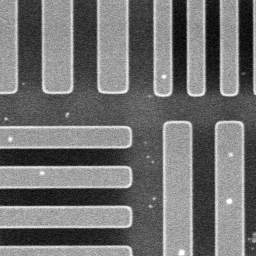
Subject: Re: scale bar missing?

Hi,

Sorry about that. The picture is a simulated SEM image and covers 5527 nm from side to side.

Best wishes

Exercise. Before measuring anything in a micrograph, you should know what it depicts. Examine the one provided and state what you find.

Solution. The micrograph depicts groups of lines, slits or small figures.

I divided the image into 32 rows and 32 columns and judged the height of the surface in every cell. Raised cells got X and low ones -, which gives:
XX---XXXX---XXXX---XX--XXX--XX--
XX---XXXX---XXXX---XX--XXX--XX--
XX---XXXX---XXXX---XX--XXX--XX--
XX---XXXX---XXXX---XX--XXX--XX--
XX---XXXX---XXXX---XX--XXX--XX--
XX---XXXX---XXXX---XX--XXX--XX--
XX---XXXX---XXXX---XX--XXX--XX--
XX---XXXX---XXXX---XX--XXX--XX--
XX---XXXX---XXXX---XX--XXX--XX--
XX---XXXX---XXXX---XX--XXX--XX--
XX---XXXX---XXXX---XX--XXX--XX--
XX----XXX----XXX---XX---X---XX--
--------------------------------
--------------------------------
--------------------------------
---------------------XXX---XXX--
XXXXXXXXXXXXXXXX----XXXX---XXX--
XXXXXXXXXXXXXXXX----XXXX---XXX--
--------------------XXXX---XXX--
--------------------XXXX---XXX--
--------------------XXXX---XXX--
XXXXXXXXXXXXXXXX----XXXX---XXX--
XXXXXXXXXXXXXXXX----XXXX---XXX--
--------------------XXXX---XXX--
--------------------XXXX---XXX--
--------------------XXXX---XXX--
XXXXXXXXXXXXXXXX----XXXX---XXX--
XXXXXXXXXXXXXXXX----XXXX---XXX--
--------------------XXXX---XXX--
--------------------XXXX---XXX--
--------------------XXXX---XXX--
XXXXXXXXXXXXXXXX----XXXX---XXX--